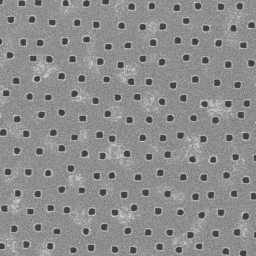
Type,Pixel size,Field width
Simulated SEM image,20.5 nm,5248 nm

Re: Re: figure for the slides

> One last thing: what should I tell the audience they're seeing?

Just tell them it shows a regular array of holes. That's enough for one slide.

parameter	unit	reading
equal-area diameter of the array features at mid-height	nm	148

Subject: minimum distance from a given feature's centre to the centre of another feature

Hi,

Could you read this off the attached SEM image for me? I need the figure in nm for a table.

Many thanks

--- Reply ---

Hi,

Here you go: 376